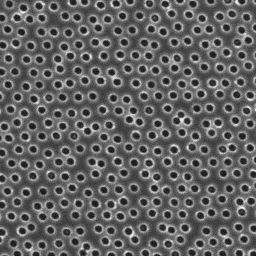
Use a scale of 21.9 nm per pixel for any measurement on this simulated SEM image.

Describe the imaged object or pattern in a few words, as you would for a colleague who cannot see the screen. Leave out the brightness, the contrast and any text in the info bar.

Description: a regular array of holes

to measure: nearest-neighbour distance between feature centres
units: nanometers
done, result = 279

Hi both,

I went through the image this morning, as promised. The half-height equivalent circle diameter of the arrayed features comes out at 164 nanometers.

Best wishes